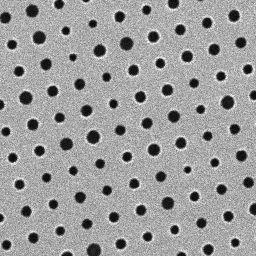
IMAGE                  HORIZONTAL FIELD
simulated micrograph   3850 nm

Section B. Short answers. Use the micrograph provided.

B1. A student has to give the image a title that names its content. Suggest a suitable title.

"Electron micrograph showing a regular array of holes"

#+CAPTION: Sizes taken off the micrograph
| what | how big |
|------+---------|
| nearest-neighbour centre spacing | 412 nm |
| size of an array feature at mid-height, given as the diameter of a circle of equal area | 0.169 um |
